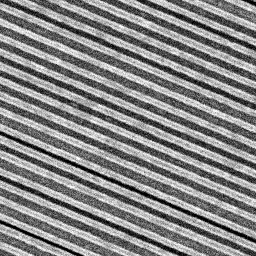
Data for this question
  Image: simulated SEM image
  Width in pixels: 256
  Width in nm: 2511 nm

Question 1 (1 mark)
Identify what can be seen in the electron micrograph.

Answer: parallel lines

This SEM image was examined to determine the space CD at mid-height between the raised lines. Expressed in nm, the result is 75.7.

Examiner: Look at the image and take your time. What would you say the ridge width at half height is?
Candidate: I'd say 57.6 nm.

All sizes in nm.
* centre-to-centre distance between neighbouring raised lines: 134